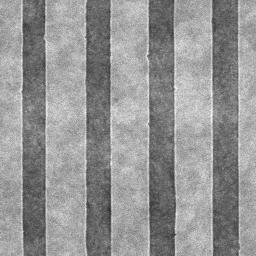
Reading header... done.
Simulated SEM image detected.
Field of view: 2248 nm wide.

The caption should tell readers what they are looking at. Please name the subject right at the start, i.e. one or a few lines or trenches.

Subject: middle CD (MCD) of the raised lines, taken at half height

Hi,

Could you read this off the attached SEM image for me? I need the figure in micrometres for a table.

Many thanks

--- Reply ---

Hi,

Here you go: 0.325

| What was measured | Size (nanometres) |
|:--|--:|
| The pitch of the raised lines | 560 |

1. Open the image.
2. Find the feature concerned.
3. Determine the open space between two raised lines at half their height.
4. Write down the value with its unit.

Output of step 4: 230 nm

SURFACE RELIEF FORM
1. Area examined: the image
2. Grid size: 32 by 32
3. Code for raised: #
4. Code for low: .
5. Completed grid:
###...#####...#####...####....##
###...#####...####....####....##
###...#####...#####...####....##
###...#####...#####...####....##
###...#####...#####...####....##
###...#####...#####...####....##
###...#####...####....####....##
###...#####...####....####....##
###...#####...#####...####....##
###...#####...#####...####....##
###...#####...#####...####....##
###...#####...#####...####....##
###...#####...#####...####....##
###...#####...#####...####....##
###...#####...#####...####....##
###...#####...#####...####....##
###...#####...#####...####....##
###...#####...#####...####....##
###...#####...#####...####....##
###...#####...####....####....##
###...#####...####....####....##
###...#####...####....####....##
###...#####...####....####....##
###...#####...####....####....##
###...#####...####....####....##
###...#####...#####...####....##
###...#####...#####...####....##
###...#####...#####...####....##
###...#####...#####...####....##
###...#####...#####...####....##
###...#####...#####...####....##
###...#####...#####...####....##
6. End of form